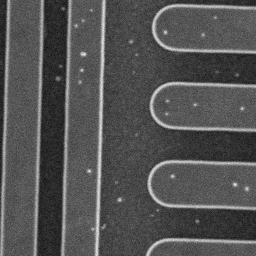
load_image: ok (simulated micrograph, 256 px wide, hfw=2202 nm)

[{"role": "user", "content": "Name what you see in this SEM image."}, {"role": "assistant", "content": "groups of lines, slits or small figures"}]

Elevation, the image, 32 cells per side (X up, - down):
-XXXX----XXXX-------------------
-XXXX----XXXX-------XXXXXXXXXXXX
-XXXX----XXXX------XXXXXXXXXXXXX
-XXXX----XXXX------XXXXXXXXXXXXX
-XXXX----XXXX------XXXXXXXXXXXXX
-XXXX----XXXX-------XXXXXXXXXXXX
-XXXX----XXXX---------------XXXX
-XXXX---XXXXX-------------------
-XXXX---XXXXX-------------------
-XXXX---XXXXX-------------------
-XXXX---XXXXX--------XXXX-------
-XXXX---XXXXX------XXXXXXXXXXXXX
-XXXX---XXXXX------XXXXXXXXXXXXX
-XXXX---XXXXX------XXXXXXXXXXXXX
-XXXX---XXXXX------XXXXXXXXXXXXX
-XXXX---XXXXX-------XXXXXXXXXXXX
-XXXX---XXXXX-------------------
XXXXX---XXXXX-------------------
XXXXX---XXXXX-------------------
XXXXX---XXXXX-------------------
XXXXX---XXXXX-------XXXXXXXXXXXX
XXXXX---XXXX-------XXXXXXXXXXXXX
XXXXX---XXXX-------XXXXXXXXXXXXX
XXXXX---XXXX-------XXXXXXXXXXXXX
XXXXX---XXXX-------XXXXXXXXXXXXX
XXXXX---XXXX--------XXXXXXXXXXXX
XXXXX---XXXX--------------------
XXXXX---XXXX--------------------
XXXXX---XXXX--------------------
XXXXX---XXXX--------------------
XXXXX---XXXX-------XXXXXXXXXXXXX
XXXX----XXXX-------XXXXXXXXXXXXX